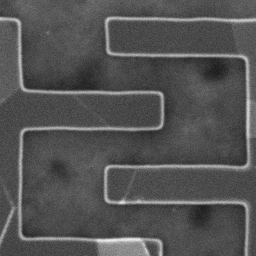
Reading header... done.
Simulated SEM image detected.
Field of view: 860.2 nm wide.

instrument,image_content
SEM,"groups of lines, slits or small figures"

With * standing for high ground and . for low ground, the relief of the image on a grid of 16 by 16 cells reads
................
*......*********
*......*********
*.............**
*..............*
**.............*
**********.....*
**********.....*
*..............*
*...............
*......*********
*......*********
*......*********
*..............*
*..............*
**********.....*